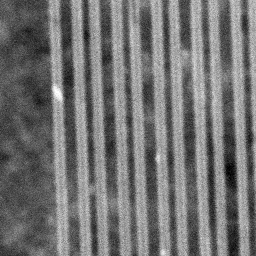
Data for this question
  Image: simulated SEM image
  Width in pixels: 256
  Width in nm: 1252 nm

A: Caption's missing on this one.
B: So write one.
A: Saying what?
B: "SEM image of parallel lines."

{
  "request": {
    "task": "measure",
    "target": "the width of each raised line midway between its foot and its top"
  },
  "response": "37.8 nm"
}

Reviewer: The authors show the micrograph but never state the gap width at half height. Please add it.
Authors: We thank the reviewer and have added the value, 13.5 pixels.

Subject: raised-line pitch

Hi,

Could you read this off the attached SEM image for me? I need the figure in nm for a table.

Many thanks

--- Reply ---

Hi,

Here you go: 98.5